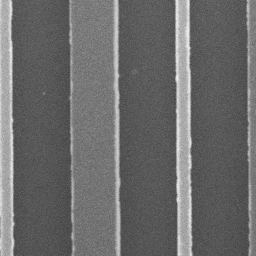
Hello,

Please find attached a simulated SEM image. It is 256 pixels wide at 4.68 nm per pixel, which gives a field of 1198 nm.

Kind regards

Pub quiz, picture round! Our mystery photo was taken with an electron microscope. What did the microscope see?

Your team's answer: lines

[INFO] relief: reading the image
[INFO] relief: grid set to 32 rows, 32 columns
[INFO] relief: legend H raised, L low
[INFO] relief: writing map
HLLLLLLLLHHHHHHLLLLLLLHLLLLLLLLH
HLLLLLLLLHHHHHHLLLLLLLHHLLLLLLLH
HLLLLLLLLHHHHHHLLLLLLLHLLLLLLLLH
HLLLLLLLLHHHHHHLLLLLLLHLLLLLLLLH
HLLLLLLLLHHHHHHLLLLLLLHLLLLLLLLH
HLLLLLLLLHHHHHHLLLLLLLHLLLLLLLLH
HLLLLLLLLHHHHHHLLLLLLLHLLLLLLLLH
HLLLLLLLLHHHHHHLLLLLLLHLLLLLLLLH
HLLLLLLLLHHHHHHLLLLLLLHHLLLLLLLH
HLLLLLLLLHHHHHHLLLLLLLHHLLLLLLLH
HLLLLLLLLHHHHHHLLLLLLLHHLLLLLLLH
HLLLLLLLLHHHHHHLLLLLLLHHLLLLLLLH
HLLLLLLLLHHHHHHLLLLLLLHHLLLLLLLH
HLLLLLLLLHHHHHHLLLLLLLHHLLLLLLLH
HLLLLLLLLHHHHHHLLLLLLLHHLLLLLLLH
HLLLLLLLLHHHHHHLLLLLLLHHLLLLLLLH
HLLLLLLLLHHHHHHLLLLLLLHHLLLLLLLH
HLLLLLLLLHHHHHHLLLLLLLHHLLLLLLLH
HLLLLLLLLHHHHHHLLLLLLLHHLLLLLLLH
HLLLLLLLLHHHHHHLLLLLLLHHLLLLLLLH
HLLLLLLLLHHHHHHLLLLLLLHHLLLLLLLH
HLLLLLLLLHHHHHHLLLLLLLHHLLLLLLLH
HLLLLLLLLHHHHHHLLLLLLLHHLLLLLLLH
HHLLLLLLLHHHHHHLLLLLLLHHLLLLLLLH
HLLLLLLLLHHHHHHLLLLLLLHHLLLLLLLH
HHLLLLLLLHHHHHHLLLLLLLHHLLLLLLLH
HHLLLLLLLHHHHHHLLLLLLLHHLLLLLLLH
HHLLLLLLLHHHHHHLLLLLLLHHLLLLLLLH
HHLLLLLLLHHHHHHLLLLLLLHHLLLLLLLH
HHLLLLLLLHHHHHHLLLLLLLHHLLLLLLLH
HHLLLLLLLHHHHHHLLLLLLLHHLLLLLLLH
HHLLLLLLLHHHHHHLLLLLLLHHLLLLLLLH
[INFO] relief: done